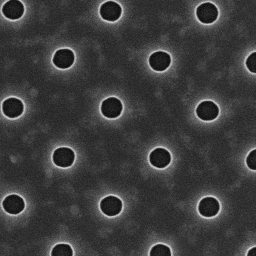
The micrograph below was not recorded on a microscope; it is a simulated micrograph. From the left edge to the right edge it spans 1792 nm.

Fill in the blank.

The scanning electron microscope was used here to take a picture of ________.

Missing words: a regular array of holes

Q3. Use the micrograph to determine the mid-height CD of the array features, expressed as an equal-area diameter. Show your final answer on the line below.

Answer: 154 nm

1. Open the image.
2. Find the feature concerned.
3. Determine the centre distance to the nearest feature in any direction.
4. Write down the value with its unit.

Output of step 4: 475 nm